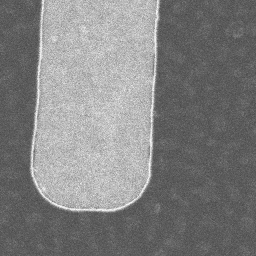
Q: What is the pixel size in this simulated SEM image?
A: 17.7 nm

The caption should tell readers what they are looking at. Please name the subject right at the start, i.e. one or a few lines or trenches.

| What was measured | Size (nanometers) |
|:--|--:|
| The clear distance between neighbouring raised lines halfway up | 2020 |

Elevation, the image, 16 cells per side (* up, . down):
***.......******
***.......******
***.......******
***.......******
**........******
**........******
**........******
**.......*******
**.......*******
**.......*******
**.......*******
**.......*******
***.....********
****************
****************
****************